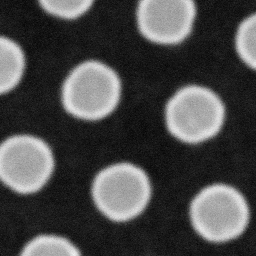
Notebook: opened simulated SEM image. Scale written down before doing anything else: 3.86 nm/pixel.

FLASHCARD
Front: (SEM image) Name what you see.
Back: raised bodies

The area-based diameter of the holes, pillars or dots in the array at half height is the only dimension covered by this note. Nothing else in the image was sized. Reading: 211 nm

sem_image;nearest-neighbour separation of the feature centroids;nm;390